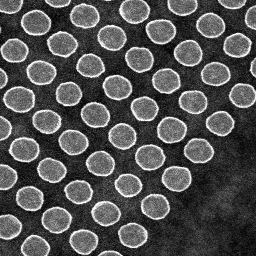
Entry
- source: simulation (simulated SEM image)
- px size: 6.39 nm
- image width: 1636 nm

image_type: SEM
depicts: a regular array of raised bodies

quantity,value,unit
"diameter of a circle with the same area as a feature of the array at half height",167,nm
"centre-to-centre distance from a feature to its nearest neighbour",0.219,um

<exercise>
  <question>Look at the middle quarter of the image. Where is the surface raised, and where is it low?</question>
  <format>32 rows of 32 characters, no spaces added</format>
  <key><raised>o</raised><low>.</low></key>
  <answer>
...ooooooo......oooooo..........
...ooooooo.......oooo...ooo.....
....ooooo..............ooooo....
...........oooo.......ooooooo...
..........oooooo......ooooooo...
ooo.......ooooooo.....ooooooo...
oooo......ooooooo......ooooo....
oooo.......ooooo..............oo
oooo........ooo....oo........ooo
oooo.............oooooo......ooo
.....ooooo.......oooooo......ooo
.....oooooo......oooooo.......oo
....ooooooo......oooooo.........
.....oooooo.......oooo...oo.....
.....oooooo.............ooooo...
.......ooo...ooo........oooooo..
............ooooo.......ooooooo.
ooooo......ooooooo......oooooo..
oooooo.....ooooooo......oooooo..
oooooo......oooooo.......ooo...o
oooooo.......oooo...oo........oo
ooooo..............ooooo......oo
.oo....oooo.......ooooooo.....oo
......oooooo......ooooooo......o
......oooooo......ooooooo.......
......ooooooo......ooooo........
o.....oooooo.............oooooo.
........ooo..............ooooooo
..............oooo.......ooooooo
..ooo........oooooo......ooooooo
.ooooo.......oooooo......oooooo.
ooooooo......oooooo........ooo..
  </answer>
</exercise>